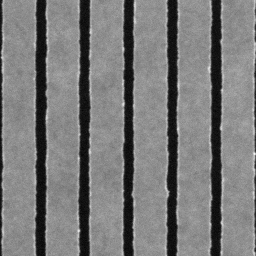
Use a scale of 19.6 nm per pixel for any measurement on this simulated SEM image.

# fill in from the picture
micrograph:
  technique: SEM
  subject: parallel lines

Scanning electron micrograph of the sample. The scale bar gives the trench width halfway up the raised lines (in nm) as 203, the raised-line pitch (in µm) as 0.858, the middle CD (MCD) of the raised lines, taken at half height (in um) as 0.654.